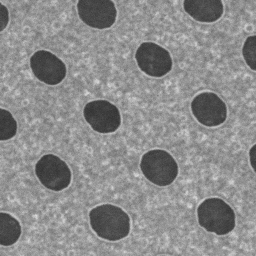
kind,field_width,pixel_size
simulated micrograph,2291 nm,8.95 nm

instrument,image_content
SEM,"a regular array of holes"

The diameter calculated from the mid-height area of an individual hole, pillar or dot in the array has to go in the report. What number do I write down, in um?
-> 0.322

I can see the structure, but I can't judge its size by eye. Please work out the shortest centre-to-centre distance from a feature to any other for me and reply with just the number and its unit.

74 px